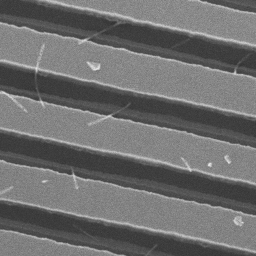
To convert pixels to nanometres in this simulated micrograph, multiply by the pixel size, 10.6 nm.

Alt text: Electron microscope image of lines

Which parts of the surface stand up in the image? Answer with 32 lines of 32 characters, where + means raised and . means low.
......+++++++++++++++++++++.....
...........++++++++++++++++++++.
................++++++++++++++++
++++.................+++++++++++
++++++++.................+++++++
++++++++++++.................+++
+++++++++++++++++...............
++++++++++++++++++++++..........
...+++++++++++++++++++++++......
.......++++++++++++++++++++++++.
............++++++++++++++++++++
................++++++++++++++++
++++.................+++++++++++
+++++++++.................++++++
++++++++++++++.................+
++++++++++++++++++..............
.++++++++++++++++++++++.........
......+++++++++++++++++++++.....
..........++++++++++++++++++++++
...............+++++++++++++++++
++..................++++++++++++
+++++++.................++++++++
+++++++++++.................++++
++++++++++++++++................
+++++++++++++++++++++...........
...++++++++++++++++++++++.......
.......+++++++++++++++++++++++..
............++++++++++++++++++++
.................+++++++++++++++
++++..................++++++++++
+++++++++.................++++++
++++++++++++++.................+